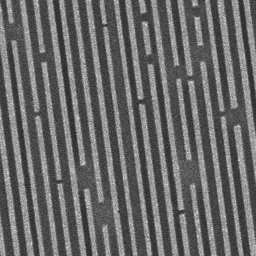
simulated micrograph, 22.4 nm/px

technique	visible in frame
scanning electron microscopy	parallel lines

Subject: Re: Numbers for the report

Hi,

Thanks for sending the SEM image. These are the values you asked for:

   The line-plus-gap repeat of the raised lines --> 292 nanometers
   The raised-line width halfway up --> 5.7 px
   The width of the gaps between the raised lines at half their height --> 172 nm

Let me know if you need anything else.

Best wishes